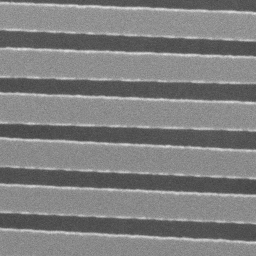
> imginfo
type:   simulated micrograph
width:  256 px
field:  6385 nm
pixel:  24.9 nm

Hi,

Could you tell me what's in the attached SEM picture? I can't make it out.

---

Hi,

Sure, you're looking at lines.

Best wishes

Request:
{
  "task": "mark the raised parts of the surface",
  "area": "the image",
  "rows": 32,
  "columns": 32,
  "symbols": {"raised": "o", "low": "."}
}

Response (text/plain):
ooooo...........................
oooooooooooooooooooooooooooooo..
oooooooooooooooooooooooooooooooo
oooooooooooooooooooooooooooooooo
..................oooooooooooooo
................................
oooooooooooooo..................
oooooooooooooooooooooooooooooooo
oooooooooooooooooooooooooooooooo
oooooooooooooooooooooooooooooooo
................................
................................
oooooooooooooooooooooooo........
oooooooooooooooooooooooooooooooo
oooooooooooooooooooooooooooooooo
......oooooooooooooooooooooooooo
................................
oooooo..........................
oooooooooooooooooooooooooo......
oooooooooooooooooooooooooooooooo
oooooooooooooooooooooooooooooooo
..............oooooooooooooooooo
................................
oooooooooo......................
oooooooooooooooooooooooooooooooo
oooooooooooooooooooooooooooooooo
oooooooooooooooooooooooooooooooo
.....................ooooooooooo
................................
ooooooooooooooooooo.............
oooooooooooooooooooooooooooooooo
oooooooooooooooooooooooooooooooo